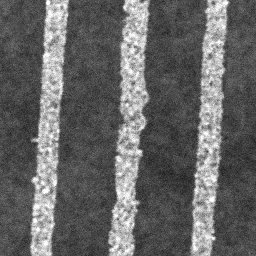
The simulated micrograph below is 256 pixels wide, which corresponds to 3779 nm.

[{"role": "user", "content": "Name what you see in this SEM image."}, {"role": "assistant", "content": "one or a few lines or trenches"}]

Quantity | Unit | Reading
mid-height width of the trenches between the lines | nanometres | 880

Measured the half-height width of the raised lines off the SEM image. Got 295 nanometers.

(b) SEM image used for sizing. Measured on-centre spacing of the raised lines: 1180 nm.